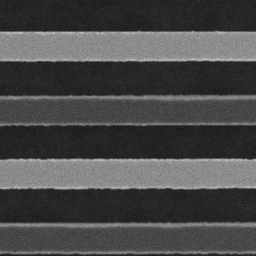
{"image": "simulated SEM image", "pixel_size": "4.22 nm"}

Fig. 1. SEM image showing lines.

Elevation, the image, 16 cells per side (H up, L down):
LLLLLLLLLLLLLLLL
LLLLLLLLLLLLLLLL
HHHHHHHHHHHHHHHH
HHHHHHHHHHHHHHHH
LLLLLLLLLLLLLLLL
LLLLLLLLLLLLLLLL
HHHHHHHHHHHHHHHH
HHHHHHHHHHHHHHHH
LLLLLLLLLLLLLLLL
LLLLLLLLLLLLLLLL
HHHHHHHHHHHHHHHH
HHHHHHHHHHHHHHHH
LLLLLLLLLLLLLLLL
LLLLLLLLLLLLLLLL
HHHHHHHHHHHHHHHH
HHHHHHHHHHHHHHHH